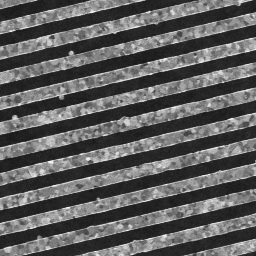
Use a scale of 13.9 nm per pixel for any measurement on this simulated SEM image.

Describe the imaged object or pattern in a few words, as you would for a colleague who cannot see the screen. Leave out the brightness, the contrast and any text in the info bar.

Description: parallel lines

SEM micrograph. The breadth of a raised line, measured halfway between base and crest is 0.162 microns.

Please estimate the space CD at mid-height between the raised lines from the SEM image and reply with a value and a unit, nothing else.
179 nm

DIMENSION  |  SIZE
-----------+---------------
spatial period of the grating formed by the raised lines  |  340 nanometers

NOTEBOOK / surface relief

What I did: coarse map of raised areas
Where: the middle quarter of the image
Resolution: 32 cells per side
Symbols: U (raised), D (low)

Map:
UUDDDDDDDDDDDDDDDDUUUUUUUUUUUUDD
DDDDDDDDDDDDDUUUUUUUUUUUUUDDDDDD
DDDDDDDDDUUUUUUUUUUUUUDDDDDDDDDD
DDDDDUUUUUUUUUUUUDDDDDDDDDDDDDDD
DUUUUUUUUUUUUDDDDDDDDDDDDDDDUUUU
UUUUUUUUUDDDDDDDDDDDDDDUUUUUUUUU
UUUUUDDDDDDDDDDDDDDUUUUUUUUUUUUD
DDDDDDDDDDDDDDUDUUUUUUUUUUUDDDDD
DDDDDDDDDDUUUDUUUUUUUUUDDDDDDDDD
DDDDDDUUUUUUUDDUUUUDDDDDDDDDDDDD
DDUUUUUUUUUUUUDDDDDDDDDDDDDDDUUU
UUUUUUUUUUDDDDDDDDDDDDDDDUUUUUUU
UUUUUUDDDDDDDDDDDDDDUUUUUUUUUUUU
UUDDDDDDDDDDDDDUDUUUUUUUUUUUUDDD
DDDDDDDDDDDDUUUUUUUUUUUUDDDDDDDD
DDDDDDDDUUUUUUUUUUUUDDDDDDDDDDDD
DDDUUUUUUUUUUUUUDDDDDDDDDDDDDDUU
UUUUUUUUUUUUDDDDDDDDDDDDDDUUUUUU
UUUUUUUDDDDDDDDDDDDDDDUUUUUUUUUU
UUUDDDDDDDDDDDDDDDUUUUUUUUUUUUDD
DDDDDDDDDDDDDUUUUUUUUUUUUUDDDDDD
DDDDDDDDDUUUUUUUUUUUUDDDDDDDDDDD
DDDDDUUUUUUUUUUUUDDDDDDDDDDDDDDU
UUUUUUUUUUUUUDDDDDDDDDDDDDDUUUUU
UUUUUUUUUDDDDDDDDDDDDDDUUUUUUUUU
UUUUDDDDDDDDDDDDDDDUUUUUUUUUUUUD
DDDDDDDDDDDDDDDUUUUUUUUUUUDDDDDD
DDDDDDDDDDUUUUUUUUUUUUDDDDDDDDDD
DDDDDDUUUUUUUUUUUUDDDDDDDDDDDDDD
DDUUUUUUUUUUUDDDDDDDDDDDDDDDUUUU
UUUUUUUUUUDDDDDDDDDDDDDDUUUUUUUU
UUUUUDDDDDDDDDDDDDDDUUUUUUUUUUUU